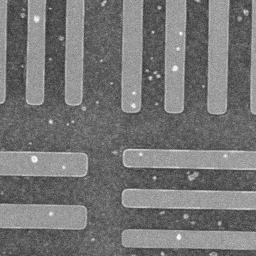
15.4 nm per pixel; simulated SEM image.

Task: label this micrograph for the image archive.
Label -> groups of lines, slits or small figures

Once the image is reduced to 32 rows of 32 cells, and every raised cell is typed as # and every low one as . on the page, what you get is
#...##..##.....###...##...###...
#...##..##.....###...##...###...
#...##..##.....###...##...###...
#...##..##.....###...##...###...
#...##..##.....###...##...###...
#..##...##.....###...##...##....
#..##...##.....###...##...##...#
#..##...##.....###...##...##...#
#..##...##.....###...##...##...#
#..##...##.....###...##...##...#
#..##...##.....###...##...##...#
#..##...##.....###...##...##...#
...##...##.....###...##...##...#
...............##....##...##...#
................................
................................
................................
................................
................................
###########....#################
###########.....################
###########.....................
................................
................................
...............#################
...............#################
###########.....................
###########.....................
..########......................
...............#################
...............#################
................................